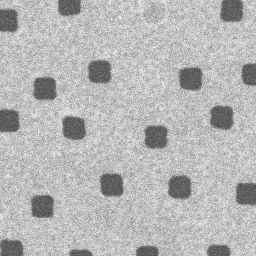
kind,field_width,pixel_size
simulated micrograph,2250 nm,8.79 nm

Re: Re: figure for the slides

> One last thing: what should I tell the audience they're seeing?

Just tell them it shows a regular array of holes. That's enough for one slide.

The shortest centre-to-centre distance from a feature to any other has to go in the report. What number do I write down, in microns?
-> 0.493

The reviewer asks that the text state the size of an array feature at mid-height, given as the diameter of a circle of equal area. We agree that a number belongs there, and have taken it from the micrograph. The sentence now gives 220 nanometers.